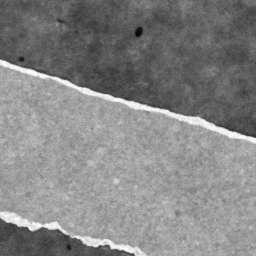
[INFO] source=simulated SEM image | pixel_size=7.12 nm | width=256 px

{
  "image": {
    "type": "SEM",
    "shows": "one or a few lines or trenches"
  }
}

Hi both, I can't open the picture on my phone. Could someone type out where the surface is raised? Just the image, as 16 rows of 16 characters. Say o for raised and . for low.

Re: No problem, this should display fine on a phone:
................
................
................
................
oo..............
ooooo...........
oooooooo........
oooooooooooo....
ooooooooooooooo.
oooooooooooooooo
oooooooooooooooo
oooooooooooooooo
oooooooooooooooo
oooooooooooooooo
....oooooooooooo
........oooooooo